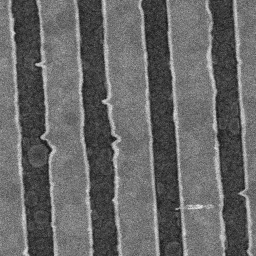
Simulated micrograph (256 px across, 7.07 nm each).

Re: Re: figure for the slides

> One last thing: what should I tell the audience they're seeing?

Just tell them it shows one or a few lines or trenches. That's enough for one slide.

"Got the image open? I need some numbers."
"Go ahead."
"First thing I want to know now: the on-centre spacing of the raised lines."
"461 nanometers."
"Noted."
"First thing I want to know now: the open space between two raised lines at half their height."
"0.19 µm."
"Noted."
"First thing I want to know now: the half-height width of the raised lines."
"270 nanometres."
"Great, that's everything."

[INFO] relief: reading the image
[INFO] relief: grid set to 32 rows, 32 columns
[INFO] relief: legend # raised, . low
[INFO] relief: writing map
#....####....#####...#####...###
#....#####...#####...#####...###
#....#####...#####...#####...###
##...#####...#####...#####....##
##...#####...#####...#####....##
##...#####...#####...#####....##
##...#####...#####...#####....##
##...#####...#####...#####....##
##...#####...#####...#####....##
##...#####...#####....#####...##
##....####....####....#####...##
##....####....####....#####...##
##....####...#####....#####...##
##....####....#####...#####...##
##....####....#####...#####...##
##....####....#####...#####...##
##....####....#####...#####...##
##....####.....####...#####...##
###...#####...#####...#####....#
###.#######...#####...#####....#
###...#####...#####...#####....#
###...#####...#####...#####....#
###...#####....####...#####....#
###...#####....####....#####...#
###...#####...#####....#####..##
###....####...#####....#####...#
###....####....####....#####...#
###....####....####....#####...#
###....####....#####...#####...#
###....####....#####...#####...#
###....####....#####...#####...#
###....####....#####...#####...#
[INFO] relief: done